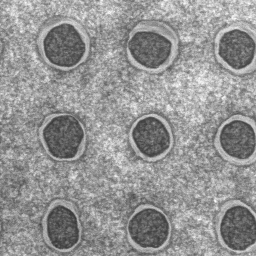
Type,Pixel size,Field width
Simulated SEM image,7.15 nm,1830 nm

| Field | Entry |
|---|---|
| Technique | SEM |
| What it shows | raised bodies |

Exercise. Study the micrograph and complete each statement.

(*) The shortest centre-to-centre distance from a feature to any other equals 86.8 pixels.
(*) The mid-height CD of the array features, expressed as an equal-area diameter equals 317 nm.